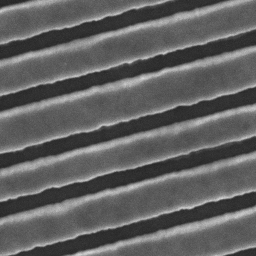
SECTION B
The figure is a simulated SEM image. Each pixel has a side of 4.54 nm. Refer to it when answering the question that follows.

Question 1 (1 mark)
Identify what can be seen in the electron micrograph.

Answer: lines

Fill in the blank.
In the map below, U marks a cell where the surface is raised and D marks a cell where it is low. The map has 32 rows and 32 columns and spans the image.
DDDUUUUUUUUUUUUUUUUUDDDDDDDUUUUU
UUUUUUUUUUUUUUUUDDDDDDDDUUUUUUUU
UUUUUUUUUUUUDDDDDDDDUUUUUUUUUUUU
UUUUUUUUDDDDDDDDUUUUUUUUUUUUUUUU
UUUUDDDDDDDDUUUUUUUUUUUUUUUUUDDD
DDDDDDDDDUUUUUUUUUUUUUUUUDDDDDDD
DDDDUUUUUUUUUUUUUUUUUDDDDDDDDUUU
UUUUUUUUUUUUUUUUUDDDDDDDDUUUUUUU
UUUUUUUUUUUUUUDDDDDDDUUUUUUUUUUU
UUUUUUUUUUDDDDDDDUUUUUUUUUUUUUUU
UUUUUDDDDDDDDDUUUUUUUUUUUUUUUUUU
UUDDDDDDDDUUUUUUUUUUUUUUUUUUUUDD
DDDDDDUUUUUUUUUUUUUUUUUUUUDDDDDD
DDUUUUUUUUUUUUUUUUUUUUDDDDDDDDUU
UUUUUUUUUUUUUUUUUUDDDDDDDDUUUUUU
UUUUUUUUUUUUUUDDDDDDDDUUUUUUUUUU
UUUUUUUUUUDDDDDDDDUUUUUUUUUUUUUU
UUUUUUDDDDDDDDUUUUUUUUUUUUUUUUDD
UUUDDDDDDDUUUUUUUUUUUUUUUUDDDDDD
DDDDDDDUUUUUUUUUUUUUUUDDDDDDDDUU
DDDUUUUUUUUUUUUUUUUDDDDDDDUUUUUU
UUUUUUUUUUUUUUDDDDDDDDUUUUUUUUUU
UUUUUUUUUUUDDDDDDDUUUUUUUUUUUUUU
UUUUUUUDDDDDDDDUUUUUUUUUUUUUUUUU
UUUDDDDDDDDUUUUUUUUUUUUUUUUUUUDD
DDDDDDDDUUUUUUUUUUUUUUUUUDDDDDDD
DDDDUUUUUUUUUUUUUUUUUUDDDDDDDDUU
UUUUUUUUUUUUUUUUUUDDDDDDDDUUUUUU
UUUUUUUUUUUUUUDDDDDDDDUUUUUUUUUU
UUUUUUUUUUDDDDDDDDUUUUUUUUUUUUUU
UUUUUUUDDDDDDDUUUUUUUUUUUUUUUUUU
UUUDDDDDDDUUUUUUUUUUUUUUUUUUUUDD